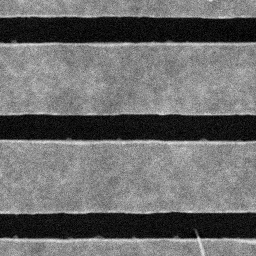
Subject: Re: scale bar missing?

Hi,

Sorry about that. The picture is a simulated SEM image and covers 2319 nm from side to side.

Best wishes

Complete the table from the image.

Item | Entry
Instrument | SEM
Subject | lines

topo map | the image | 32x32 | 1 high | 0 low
11111111111111111111111111111111
11111111111111111111111111111111
00000000000000000000000000000000
00000000000000000000000000000000
00000000000000000000000000000000
11111111111111111111111111111111
11111111111111111111111111111111
11111111111111111111111111111111
11111111111111111111111111111111
11111111111111111111111111111111
11111111111111111111111111111111
11111111111111111111111111111111
11111111111111111111111111111111
11111111111111111111111111111111
00000000000000000000000000000000
00000000000000000000000000000000
00000000000000000000000000000000
00000000000000000000000000000000
11111111111111111111111111111111
11111111111111111111111111111111
11111111111111111111111111111111
11111111111111111111111111111111
11111111111111111111111111111111
11111111111111111111111111111111
11111111111111111111111111111111
11111111111111111111111111111111
11111111111111111111111111111111
00000000000000000000000000000000
00000000000000000000000000000000
00000000000000000000000000000000
11111111111111111111111111111111
11111111111111111111111111111111